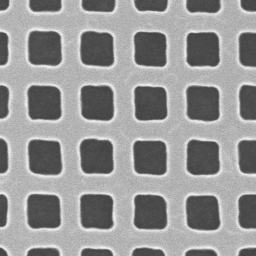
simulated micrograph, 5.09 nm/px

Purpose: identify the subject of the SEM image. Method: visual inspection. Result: a regular array of holes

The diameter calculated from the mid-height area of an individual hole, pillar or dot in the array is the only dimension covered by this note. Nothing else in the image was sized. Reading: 189 nm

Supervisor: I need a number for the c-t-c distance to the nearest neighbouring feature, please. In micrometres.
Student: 0.267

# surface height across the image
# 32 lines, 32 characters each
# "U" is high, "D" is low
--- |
DUUUDDDDUUDDDDUUUDDDDUUDDDDUUUDD
UUUUUUUUUUUUDUUUUUUDUUUUDDDUUUUU
UUUUUUUUUUUUUUUUUUUUUUUUUUUUUUUU
UUUUUUUUUUUUUUUUUUUUUUUUUUUUUUUU
DUUUDDDUUUDDDDUUUDDDDUUDDDDUUUDD
DUUDDDDDUUDDDDUUUDDDDUUDDDDUUUDD
DUUDDDDDUUDDDDUUUDDDDUUDDDDUUUDD
DUUUDDDDUUDDDDUUUDDDDUUDDDDUUUDD
UUUUUUUUUUUUUUUUUUUUUUUUUUUUUUUU
UUUUUUUUUUUUUUUUUUUUUUUUUUUUUUUU
UUUUUUUUUUUUUUUUUUUUUUUUUUUUUUUU
DUUDDDDDUUDDDDUUUDDDDUUDDDDUUUDD
DUUDDDDDUUDDDDUUUDDDDUUDDDDDUUDD
DUUDDDDDUUDDDDUUUDDDDUUDDDDDUUDD
DUUUDDDDUUDDDDUUUDDDDUUDDDDUUUDD
UUUUUUUUUUUUUUUUUUUUUUUUUUUUUUUU
UUUUUUUUUUUUUUUUUUUUUUUUUUUUUUUU
UUUUDDUUUUUDDUUUUUDUUUUUDDUUUUUU
DUUUDDDUUUDDDDUUUDDDDUUDDDDUUUDD
DUUUDDDDUUDDDDUUUDDDDUUDDDDUUUDD
DUUUDDDDUUDDDDUUUDDDDUUDDDDUUUDD
DUUUDDDUUUUDDDUUUDDDDUUUDDDUUUDD
UUUUUUUUUUUUUUUUUUUUUUUUUUUUUUUU
UUUUUUUUUUUUUUUUUUUUUUUUUUUUUUUU
DUUUDDDUUUDDDDUUUDDDUUUUDDUUUUDD
DUUDDDDUUUDDDDUUUDDDDUUDDDDUUUDD
DUUDDDDDUUDDDDUUUDDDDUUDDDDUUUDD
DUUDDDDDUUDDDDUUUDDDDUUDDDDUUUDD
UUUUDDDUUUUDDDUUUDDDDUUUDDDUUUDD
UUUUUUUUUUUUUUUUUUUUUUUUUUUUUUUU
UUUUUUUUUUUUUUUUUUUUUUUUUUUUUUUU
DUUUDDDUUUDDDDUUUDDDUUUDDDDUUUDD